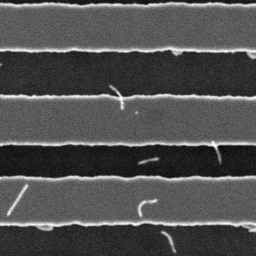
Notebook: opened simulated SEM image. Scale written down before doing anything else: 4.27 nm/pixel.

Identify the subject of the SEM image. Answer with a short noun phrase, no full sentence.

lines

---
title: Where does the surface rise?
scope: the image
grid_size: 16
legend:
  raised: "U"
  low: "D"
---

UUUUUUUUUUUUUUUU
UUUUUUUUUUUUUUUU
UUUUUUUUUUUUUUUU
DDDDDDDDDDDDDDDD
DDDDDDDDDDDDDDDD
DDDDDDDDDDDDDDDD
UUUUUUUUUUUUUUUU
UUUUUUUUUUUUUUUU
UUUUUUUUUUUUUUUU
DDDDDDDDDDDDDDDD
DDDDDDDDDDDDDDDD
UUUUUUUUUUUUUUUU
UUUUUUUUUUUUUUUU
UUUUUUUUUUUUUUUU
DDDDDDDDDDDDDDDD
DDDDDDDDDDDDDDDD